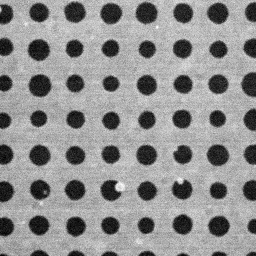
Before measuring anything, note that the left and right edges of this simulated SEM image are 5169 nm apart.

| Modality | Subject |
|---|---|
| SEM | a regular array of holes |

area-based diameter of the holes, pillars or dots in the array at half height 0.412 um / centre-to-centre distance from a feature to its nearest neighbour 703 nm